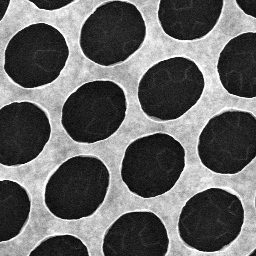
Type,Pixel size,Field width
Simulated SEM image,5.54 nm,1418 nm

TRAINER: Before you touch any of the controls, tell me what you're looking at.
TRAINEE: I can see holes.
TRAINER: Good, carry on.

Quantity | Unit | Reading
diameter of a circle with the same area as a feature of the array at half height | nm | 354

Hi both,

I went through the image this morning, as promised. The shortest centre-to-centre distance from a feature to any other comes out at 435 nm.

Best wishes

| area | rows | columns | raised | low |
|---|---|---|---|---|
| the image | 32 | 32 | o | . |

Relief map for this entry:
.ooo.....oooo....ooo........oo..
.ooooooooooo.....ooo........oo..
ooooooooooo.......oo.......ooooo
ooo....ooo........oo.......ooooo
oo......oo........ooo.....oooo..
o.......oo........oooooooooo....
o........o.......ooooooooooo....
o.......ooo.....ooooo...ooo.....
o.......ooooooooooo......oo.....
o......ooooooooooo.......oo.....
oo....ooooo....oo.........oo....
ooooooooo......oo........oooo...
oooooooo........o........ooooooo
.....ooo........oo......oooooooo
......oo........oo.....oooo.....
......oo.......ooooooooooo......
......oo......ooooooooooo.......
......ooo....oooo.....ooo.......
.....ooooooooooo.......oo.......
.....ooooo..oooo.......oo.......
...ooooo.....oo........oo......o
ooooooo.......o........oooo...oo
oooooo........o.......oooooooooo
...ooo........oo.....ooooooooooo
....oo.......oooo...oooo.....ooo
....oo.......oooooooooo.......oo
....oo......ooooo..oooo.......oo
...ooooooooooo......oo.........o
...oooooooooo........o........oo
..ooooo..oooo........o........oo
ooooo......oo........oo......ooo
oooo.......oo........oooooooooo.